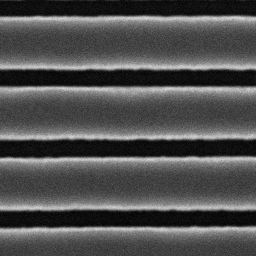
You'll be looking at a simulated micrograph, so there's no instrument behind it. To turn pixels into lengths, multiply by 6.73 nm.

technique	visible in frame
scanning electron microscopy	lines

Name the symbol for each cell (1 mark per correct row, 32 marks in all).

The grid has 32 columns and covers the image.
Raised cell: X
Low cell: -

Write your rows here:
--------------------------------
--------------------------------
XXXXXXXXXXXXXXXXXXXXXXXXXXXXXXXX
XXXXXXXXXXXXXXXXXXXXXXXXXXXXXXXX
XXXXXXXXXXXXXXXXXXXXXXXXXXXXXXXX
XXXXXXXXXXXXXXXXXXXXXXXXXXXXXXXX
XXXXXXXXXXXXXXXXXXXXXXXXXXXXXXXX
XXXXXXXXXXXXXXXXXXXXXXXXXXXXXXXX
XXXXXXXXXXXXXXXXXXXXXXXXXXXXXXXX
--------------------------------
--------------------------------
XXXXXXXXXXXXXXXXXXXXXXXXXXXXXXXX
XXXXXXXXXXXXXXXXXXXXXXXXXXXXXXXX
XXXXXXXXXXXXXXXXXXXXXXXXXXXXXXXX
XXXXXXXXXXXXXXXXXXXXXXXXXXXXXXXX
XXXXXXXXXXXXXXXXXXXXXXXXXXXXXXXX
XXXXXXXXXXXXXXXXXXXXXXXXXXXXXXXX
--------------------------------
--------------------------------
--------------------------------
XXXXXXXXXXXXXXXXXXXXXXXXXXXXXXXX
XXXXXXXXXXXXXXXXXXXXXXXXXXXXXXXX
XXXXXXXXXXXXXXXXXXXXXXXXXXXXXXXX
XXXXXXXXXXXXXXXXXXXXXXXXXXXXXXXX
XXXXXXXXXXXXXXXXXXXXXXXXXXXXXXXX
XXXXXXXXXXXXXXXXXXXXXXXXXXXXXXXX
--------------------------------
--------------------------------
----XX-X-XXXXXXXXXXXXXXXXXXXXXXX
XXXXXXXXXXXXXXXXXXXXXXXXXXXXXXXX
XXXXXXXXXXXXXXXXXXXXXXXXXXXXXXXX
XXXXXXXXXXXXXXXXXXXXXXXXXXXXXXXX